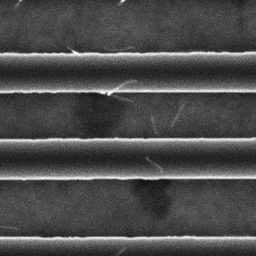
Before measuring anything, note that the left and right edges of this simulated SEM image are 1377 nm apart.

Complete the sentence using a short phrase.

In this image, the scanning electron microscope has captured lines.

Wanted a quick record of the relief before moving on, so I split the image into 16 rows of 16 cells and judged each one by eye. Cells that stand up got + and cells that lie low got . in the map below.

................
................
................
++++++++++++++++
++++++++++++++++
++++++++++++++++
................
................
................
++++++++++++++++
++++++++++++++++
................
................
................
................
++++++++++++++++